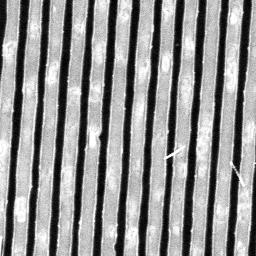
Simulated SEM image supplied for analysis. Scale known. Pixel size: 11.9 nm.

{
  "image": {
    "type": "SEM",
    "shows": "parallel lines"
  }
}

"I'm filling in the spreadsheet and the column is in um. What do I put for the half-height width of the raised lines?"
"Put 0.125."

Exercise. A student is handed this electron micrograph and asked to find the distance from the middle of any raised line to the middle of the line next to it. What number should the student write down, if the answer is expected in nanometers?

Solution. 264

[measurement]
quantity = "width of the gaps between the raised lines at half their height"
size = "144 nanometers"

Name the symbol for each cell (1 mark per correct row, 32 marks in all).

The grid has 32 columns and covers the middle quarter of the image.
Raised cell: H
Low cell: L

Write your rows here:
HLLLHHHLLLHHHLLLHHLLLHHHLHLHHLLL
HLLLHHHLLLHHHLLLHHLLLHHHLLLHHLLL
HLLLHHHLLLHHLLLHHHLLLHHHLLLHHLLL
HLLLHHHLLLHHLLLHHHLLLHHHLLLHHLLL
HLLLHHHLLLHHLLLHHHLLLHHHLLLHHLLL
HLLLHHHLLLHHLLLHHHLLLHHHLLLHHLLL
HLLLHHLLLLHHLLLHHHLLLHHLLLLHHLLL
HLLLHHLLLLHHLLLHHHLLLHHLLLHHHLLL
HLLLHHLLLHHHLLLHHHLLLHHLLLHHHLLL
HLLLHHLLLHHHLLLHHHLLLHHLLLHHHLLL
HLLLHHLLLHHHLLLHHLLLLHHLLLHHLLLL
HLLLHHLLLHHHLLLHHLLLLHHLLLHHLLLL
HLLLHHLLLHHHLLLHHLLLHHHLLLHHLLLL
HLLLHHLLLHHHLLLHHLLLHHHLLLHHLLLH
LLLLHHLLLHHHLLLHHLLLHHHLLLHHLLLH
LLLLHHLLLHHHLLLHHLLLHHLLLLHHLLLH
LLLLHHLLLHHLLLHHHLLLHHLLLLHHLLLL
LLLLHHLLLHHLLLHHHLLLHHHLLLHHLLLH
LLLHHHLLHHHLLLLHHLLLHHLLLLHHLLLH
LLLHHHLLLHHLLLLHHLLLHHLLLLHHLLLH
LLLHHHLLLHHLLLHHHLLLHHLLLLHHLLLH
LLLHHHLLLHHLLLHHHLLLHHLLLLHHLLLH
LLLHHHLLLHHLLLHHHLLLHHLLLHHHLLLH
LLLHHHLLLHHLLLHHHLLLHHLLLHHHLLLH
LLLHHLLLHHHLLLHHHLLLHHLLLHHLLLLH
LLLHHLLLHHHLLLHHHLLLHHLLLHHHLLLH
LLLHHLLLHHHLLLHHLLLLHHLLLHHHLLLH
LLLHHLLLHHHLLLHHLLLHHHLLLHHHLLLH
LLLHHLLLHHHLLLHHLLLHHHLLLHHLLLHH
LLHHHLLLHHHLLLHHLLLHHHLLLHHLLLHH
LLHHHLLLHHHLLLHHLLLHHHLLLHHLLLHH
LLLHHLLLHHLLLLHHLLLHHHLLLHHLLLHH